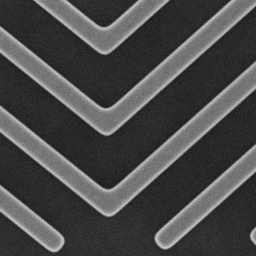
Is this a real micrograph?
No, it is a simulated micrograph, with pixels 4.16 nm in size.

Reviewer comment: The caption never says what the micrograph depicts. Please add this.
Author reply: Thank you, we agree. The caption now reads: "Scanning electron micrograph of groups of lines, slits or small figures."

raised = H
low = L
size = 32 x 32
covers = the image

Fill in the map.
LLLLLHHHHLLLLLLLLHHHHLLLLLLLHHHH
LLLLLLHHHHLLLLLLHHHHLLLLLLLHHHHL
LLLLLLLHHHHLLLLHHHLLLLLLLLHHHHLL
LLLLLLLLHHHHHHHHHLLLLLLLLHHHHLLL
HLLLLLLLLLHHHHHHLLLLLLLLHHHHLLLL
HHHLLLLLLLLHHHHLLLLLLLLHHHHLLLLL
HHHHLLLLLLLLHHLLLLLLLLHHHHLLLLLL
LHHHHLLLLLLLLLLLLLLLLHHHLLLLLLLL
LLHHHHLLLLLLLLLLLLLHHHHLLLLLLLLH
LLLLHHHHLLLLLLLLLLHHHHLLLLLLLLHH
LLLLLHHHHLLLLLLLLHHHHLLLLLLLLHHH
LLLLLLHHHHLLLLLLHHHHLLLLLLLLHHHH
LLLLLLLHHHHLLLLHHHHLLLLLLLLHHHLL
LLLLLLLLLHHHHHHHHHLLLLLLLHHHHLLL
HHLLLLLLLLHHHHHHHLLLLLLLHHHHLLLL
HHHLLLLLLLLHHHHLLLLLLLLHHHHLLLLL
HHHHLLLLLLLLHHLLLLLLLLHHHHLLLLLL
LHHHHLLLLLLLLLLLLLLLLHHHHLLLLLLL
LLHHHHHLLLLLLLLLLLLLHHHHLLLLLLLH
LLLLHHHHLLLLLLLLLLLHHHHLLLLLLLHH
LLLLLHHHHLLLLLLLLLHHHLLLLLLLLHHH
LLLLLLHHHHLLLLLLHHHHLLLLLLLLHHHH
LLLLLLLHHHHHLLLHHHHLLLLLLLLHHHHL
LLLLLLLLLHHHHLHHHHLLLLLLLLHHHHLL
HHLLLLLLLLHHHHHHHLLLLLLLLHHHHLLL
HHHLLLLLLLLHHHHHLLLLLLLLHHHLLLLL
HHHHLLLLLLLLHHHLLLLLLLHHHHLLLLLL
LHHHHLLLLLLLLLLLLLLLLHHHHLLLLLLL
LLLHHHHLLLLLLLLLLLLLHHHHLLLLLLLL
LLLLHHHHLLLLLLLLLLLHHHHLLLLLLLLH
LLLLLHHHLLLLLLLLLLLLHHLLLLLLLLLL
LLLLLLLLLLLLLLLLLLLLLLLLLLLLLLLL